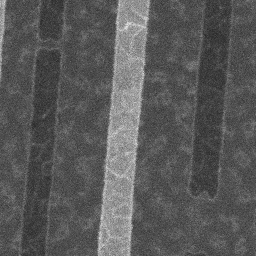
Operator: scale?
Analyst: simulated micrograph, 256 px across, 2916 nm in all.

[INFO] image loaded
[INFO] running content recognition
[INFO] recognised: one or a few lines or trenches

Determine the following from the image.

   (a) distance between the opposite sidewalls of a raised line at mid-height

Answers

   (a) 0.322 microns